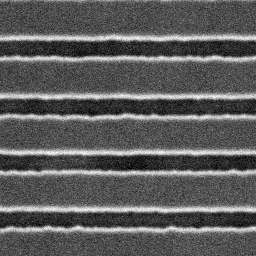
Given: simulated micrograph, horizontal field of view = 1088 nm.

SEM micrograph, lines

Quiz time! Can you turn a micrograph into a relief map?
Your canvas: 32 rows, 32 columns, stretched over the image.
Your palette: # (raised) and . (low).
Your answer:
################################
################################
################################
################################
################################
................................
................................
################################
################################
################################
################################
################################
................................
................................
#######..#.....###.#........#.#.
################################
################################
################################
################################
................................
................................
##############..###.##.#..######
################################
################################
################################
################################
................................
................................
.#...##..##..........#.........#
################################
################################
################################